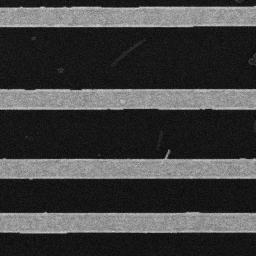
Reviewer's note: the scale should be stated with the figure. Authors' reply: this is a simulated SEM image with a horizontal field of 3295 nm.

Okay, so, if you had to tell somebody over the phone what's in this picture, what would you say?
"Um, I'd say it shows lines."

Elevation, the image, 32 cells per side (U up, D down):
DDDDDDDDDDDDDDDDDDDDDDDDDDDDDDDD
UUUUUUUUUUUUUUUUUUUUUUUUUUUUUUUU
UUUUUUUUUUUUUUUUUUUUUUUUUUUUUUUU
DDDDDDDDDDDDDDDDDDDDDDDDDDDDDDDD
DDDDDDDDDDDDDDDDDDDDDDDDDDDDDDDD
DDDDDDDDDDDDDDDDDDDDDDDDDDDDDDDD
DDDDDDDDDDDDDDDDDDDDDDDDDDDDDDDD
DDDDDDDDDDDDDDDDDDDDDDDDDDDDDDDU
DDDDDDDDDDDDDDDDDDDDDDDDDDDDDDDD
DDDDDDDDDDDDDDDDDDDDDDDDDDDDDDDD
DDDDDDDDDDDDDDDDDDDDDDDDDDDDDDDD
UUUUUUUUUUUUUUUUUUUUUUUUUUUUUUUU
UUUUUUUUUUUUUUUUUUUUUUUUUUUUUUUU
UUUUUUUUUUUUUUUUUUUUUUUUUUUUUUUU
DDDDDDDDDDDDDDDDDDDDDDDDDDDDDDDD
DDDDDDDDDDDDDDDDDDDDDDDDDDDDDDDD
DDDDDDDDDDDDDDDDDDDDDDDDDDDDDDDD
DDDDDDDDDDDDDDDDDDDDDDDDDDDDDDDD
DDDDDDDDDDDDDDDDDDDDDDDDDDDDDDDD
DDDDDDDDDDDDDDDDDDDDDDDDDDDDDDDD
UUUUUUUUUUUUUUUUUUUUUUUUUUUUUUUU
UUUUUUUUUUUUUUUUUUUUUUUUUUUUUUUU
DDDDDDDDDDDDDDDDDDDDDDDDDDDDDDDD
DDDDDDDDDDDDDDDDDDDDDDDDDDDDDDDD
DDDDDDDDDDDDDDDDDDDDDDDDDDDDDDDD
DDDDDDDDDDDDDDDDDDDDDDDDDDDDDDDD
DDDDDDDDDDDDDDDDDDDDDDDDDDDDDDDD
UUUUUUUUUUUUUUUUUUUUUUUUUUUUUUUU
UUUUUUUUUUUUUUUUUUUUUUUUUUUUUUUU
DDDDDDDDDDDDDDDDDDDDDDDDDDDDDDDD
DDDDDDDDDDDDDDDDDDDDDDDDDDDDDDDD
DDDDDDDDDDDDDDDDDDDDDDDDDDDDDDDD